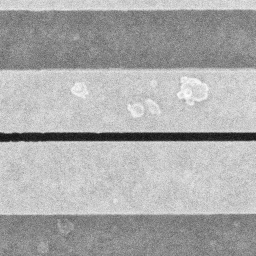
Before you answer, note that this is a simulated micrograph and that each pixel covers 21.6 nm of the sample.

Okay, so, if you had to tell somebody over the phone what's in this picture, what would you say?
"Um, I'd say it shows lines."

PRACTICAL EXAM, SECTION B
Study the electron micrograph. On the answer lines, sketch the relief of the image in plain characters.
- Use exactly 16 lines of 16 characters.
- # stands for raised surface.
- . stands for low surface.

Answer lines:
################
................
................
................
################
################
################
################
################
################
################
################
################
................
................
................